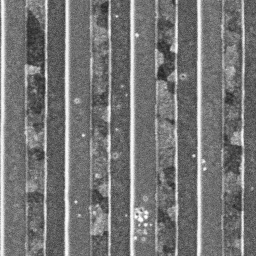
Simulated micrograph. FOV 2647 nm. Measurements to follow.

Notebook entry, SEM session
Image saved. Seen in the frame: lines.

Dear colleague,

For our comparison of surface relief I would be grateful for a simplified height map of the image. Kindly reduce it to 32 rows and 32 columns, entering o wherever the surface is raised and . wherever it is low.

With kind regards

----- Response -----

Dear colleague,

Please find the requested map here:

oooooo..oooooo...ooooo...ooooo..
oooooo..oooooo...ooooo...ooooo..
oooooo..oooooo...ooooo...ooooo..
oooooo..oooooo...ooooo...ooooo..
oooooo..oooooo...ooooo...ooooo..
oooooo..oooooo...ooooo...ooooo..
oooooo..oooooo...ooooo...ooooo..
oooooo..oooooo...ooooo...ooooo..
oooooo..oooooo...ooooo...ooooo..
oooooo..oooooo...ooooo...ooooo..
oooooo..oooooo...ooooo...ooooo..
oooooo..oooooo...ooooo...ooooo..
oooooo..oooooo...ooooo...ooooo..
oooooo..oooooo...ooooo...ooooo..
oooooo..oooooo...ooooo...ooooo..
oooooo..oooooo...ooooo...ooooo..
oooooo..oooooo...ooooo...ooooo..
oooooo..oooooo...ooooo...ooooo..
oooooo..oooooo...ooooo...ooooo..
oooooo..oooooo...ooooo...ooooo..
oooooo..oooooo...ooooo...ooooo..
oooooo..oooooo...ooooo...ooooo..
oooooo..oooooo...ooooo...ooooo..
oooooo..oooooo...ooooo...ooooo..
oooooo..oooooo...ooooo...ooooo..
oooooo..oooooo..oooooo...ooooo..
oooooo..oooooo..oooooo...ooooo..
oooooo..oooooo..oooooo...ooooo..
oooooo..oooooo..oooooo...ooooo..
oooooo..oooooo..oooooo...ooooo..
oooooo..oooooo..oooooo...ooooo..
oooooo..oooooo..oooooo...ooooo..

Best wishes